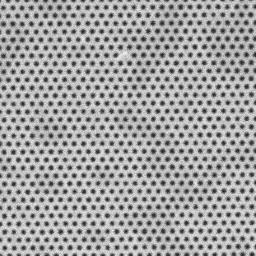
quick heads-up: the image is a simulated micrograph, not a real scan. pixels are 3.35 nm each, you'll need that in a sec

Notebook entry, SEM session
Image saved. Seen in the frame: a regular array of holes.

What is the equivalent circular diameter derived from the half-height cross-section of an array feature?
0.0181 µm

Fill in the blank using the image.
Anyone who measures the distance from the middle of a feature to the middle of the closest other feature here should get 30.3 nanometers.